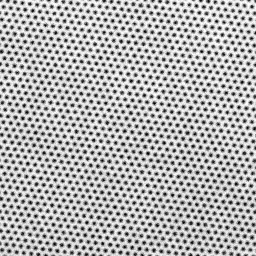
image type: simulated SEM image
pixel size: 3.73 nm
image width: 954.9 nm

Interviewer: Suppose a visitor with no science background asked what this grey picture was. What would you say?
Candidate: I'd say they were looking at a regular array of holes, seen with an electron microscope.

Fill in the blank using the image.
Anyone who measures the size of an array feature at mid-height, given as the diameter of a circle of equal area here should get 16.8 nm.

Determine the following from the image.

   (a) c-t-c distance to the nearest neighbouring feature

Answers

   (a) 25.9 nanometers